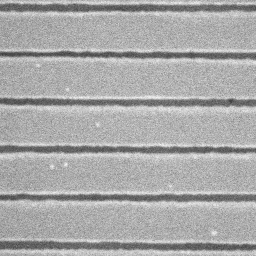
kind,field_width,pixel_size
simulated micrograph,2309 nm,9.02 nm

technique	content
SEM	lines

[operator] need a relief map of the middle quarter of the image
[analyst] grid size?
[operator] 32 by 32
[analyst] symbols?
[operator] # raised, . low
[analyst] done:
################################
################################
################################
################################
################################
################################
################################
################################
................................
................................
................................
################################
################################
################################
################################
################################
################################
################################
################################
################################
................................
................................
#####################..#..####.#
################################
################################
################################
################################
################################
################################
################################
################################
################################